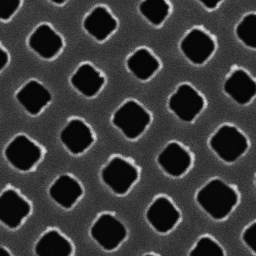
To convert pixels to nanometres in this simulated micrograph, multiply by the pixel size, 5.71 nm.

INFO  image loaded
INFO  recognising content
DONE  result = a regular array of holes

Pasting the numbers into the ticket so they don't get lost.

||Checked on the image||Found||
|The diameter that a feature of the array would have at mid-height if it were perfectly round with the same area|174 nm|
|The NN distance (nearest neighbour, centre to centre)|0.324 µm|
